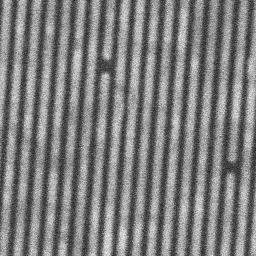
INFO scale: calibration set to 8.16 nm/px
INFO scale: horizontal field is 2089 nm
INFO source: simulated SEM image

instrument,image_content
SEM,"parallel lines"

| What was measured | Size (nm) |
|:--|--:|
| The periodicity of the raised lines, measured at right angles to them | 120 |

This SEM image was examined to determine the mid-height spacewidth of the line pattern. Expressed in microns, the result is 0.0692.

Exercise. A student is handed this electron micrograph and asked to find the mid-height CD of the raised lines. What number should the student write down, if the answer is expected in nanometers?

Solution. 51.9